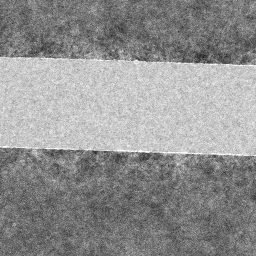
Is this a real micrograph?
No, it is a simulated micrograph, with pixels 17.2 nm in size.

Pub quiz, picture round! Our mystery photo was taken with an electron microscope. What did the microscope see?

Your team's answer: one or a few lines or trenches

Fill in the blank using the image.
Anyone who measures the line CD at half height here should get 1550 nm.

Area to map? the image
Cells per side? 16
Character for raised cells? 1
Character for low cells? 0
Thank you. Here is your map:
0000000000000000
0000000000000000
0000000000000000
0000000000000000
1111111111111111
1111111111111111
1111111111111111
1111111111111111
1111111111111111
0000000000111111
0000000000000000
0000000000000000
0000000000000000
0000000000000000
0000000000000000
0000000000000000